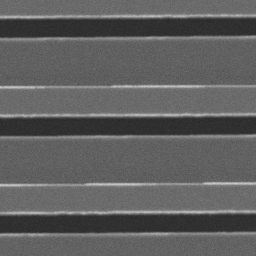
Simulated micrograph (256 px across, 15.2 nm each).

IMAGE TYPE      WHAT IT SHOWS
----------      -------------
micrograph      lines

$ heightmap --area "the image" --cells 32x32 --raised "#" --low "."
################################
################################
................................
................................
................................
################################
################################
################################
################################
################################
################################
################################
################################
################################
#####...........................
................................
................................
################################
################################
################################
################################
################################
################################
################################
################################
################################
############################.##.
................................
................................
################################
################################
################################